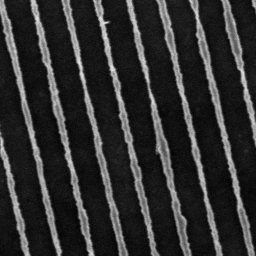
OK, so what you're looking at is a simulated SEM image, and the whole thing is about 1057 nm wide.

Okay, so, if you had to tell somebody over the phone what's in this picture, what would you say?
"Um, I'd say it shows parallel lines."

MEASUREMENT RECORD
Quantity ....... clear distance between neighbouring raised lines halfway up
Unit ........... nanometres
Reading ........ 109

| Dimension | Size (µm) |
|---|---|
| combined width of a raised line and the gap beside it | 0.129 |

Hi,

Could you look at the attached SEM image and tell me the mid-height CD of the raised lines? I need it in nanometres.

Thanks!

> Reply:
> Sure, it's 18.7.